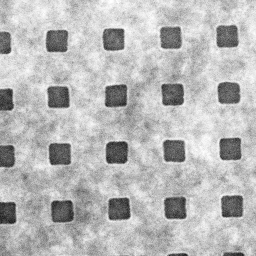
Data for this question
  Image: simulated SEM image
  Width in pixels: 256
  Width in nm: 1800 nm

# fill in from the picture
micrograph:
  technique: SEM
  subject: a regular array of holes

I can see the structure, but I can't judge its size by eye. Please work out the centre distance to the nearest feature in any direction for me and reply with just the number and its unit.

0.398 um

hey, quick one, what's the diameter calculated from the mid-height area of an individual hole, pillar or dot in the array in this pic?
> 176 nm